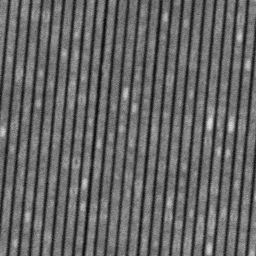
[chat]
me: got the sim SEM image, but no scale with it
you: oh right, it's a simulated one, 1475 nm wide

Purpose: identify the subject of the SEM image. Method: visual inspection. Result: parallel lines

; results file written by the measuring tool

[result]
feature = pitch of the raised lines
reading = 62.2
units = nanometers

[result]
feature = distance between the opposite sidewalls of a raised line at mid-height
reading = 48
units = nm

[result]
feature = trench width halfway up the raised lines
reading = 2.48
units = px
